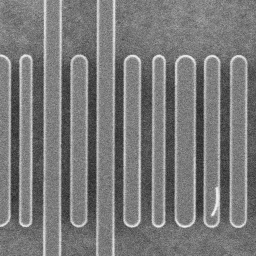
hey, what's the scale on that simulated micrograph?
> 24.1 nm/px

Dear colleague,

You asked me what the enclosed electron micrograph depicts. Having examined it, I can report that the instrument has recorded groups of lines, slits or small figures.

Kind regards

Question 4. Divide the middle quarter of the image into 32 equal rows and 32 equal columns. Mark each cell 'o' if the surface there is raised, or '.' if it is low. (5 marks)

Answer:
..oooo..oooo...oooo...ooo...oooo
..oooo..oooo...oooo...ooo...oooo
..oooo..oooo...oooo...ooo...oooo
..oooo..oooo...oooo...ooo...oooo
..oooo..oooo...oooo...ooo...oooo
..oooo..oooo...oooo...ooo...oooo
..oooo..oooo...oooo...ooo...oooo
..oooo..oooo...oooo...ooo...oooo
..oooo..oooo...oooo...ooo...oooo
..oooo..oooo...oooo...ooo...oooo
..oooo..oooo...oooo...ooo...oooo
..oooo..oooo...oooo...ooo...oooo
..oooo..oooo...oooo...ooo...oooo
..oooo..oooo...oooo...ooo...oooo
..oooo..oooo...oooo...ooo...oooo
..oooo..oooo...oooo...ooo...oooo
..oooo..oooo...oooo...ooo...oooo
..oooo..oooo...oooo...ooo...oooo
..oooo..oooo...oooo...ooo...oooo
..oooo..oooo...oooo...ooo...oooo
..oooo..oooo...oooo...ooo...oooo
..oooo..oooo...oooo...ooo...oooo
..oooo..oooo...oooo...ooo...oooo
..oooo..oooo...oooo...ooo...oooo
..oooo..oooo...oooo...ooo...oooo
..oooo..oooo...oooo...ooo...oooo
..oooo..oooo...oooo...ooo...oooo
..oooo..oooo...oooo...ooo...oooo
..oooo..oooo...oooo...ooo...oooo
..oooo..oooo...oooo...ooo...oooo
..oooo..oooo...oooo...ooo...oooo
..oooo..oooo...oooo...ooo...oooo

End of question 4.